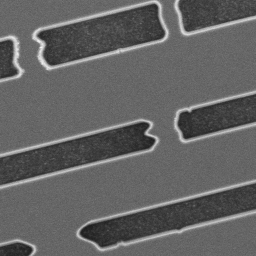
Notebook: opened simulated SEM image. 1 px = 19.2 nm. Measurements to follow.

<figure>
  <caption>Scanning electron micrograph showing one or a few lines or trenches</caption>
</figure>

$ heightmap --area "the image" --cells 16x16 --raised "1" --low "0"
1111111100100000
1111000000100011
0110000000111111
0110001111111111
0111111111111111
1111111111111111
1111111111111000
1111111111100000
1111100001100111
1000000001111111
0000011111111111
0111111111111110
1111111111100000
1111111000000001
1111100000011111
0011111111111111